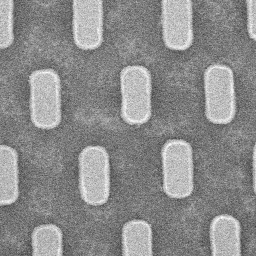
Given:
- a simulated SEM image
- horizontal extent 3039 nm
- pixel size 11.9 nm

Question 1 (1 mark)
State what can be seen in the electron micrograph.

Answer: raised bodies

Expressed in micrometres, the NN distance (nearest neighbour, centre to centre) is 0.995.